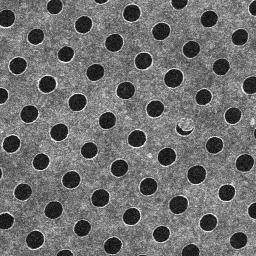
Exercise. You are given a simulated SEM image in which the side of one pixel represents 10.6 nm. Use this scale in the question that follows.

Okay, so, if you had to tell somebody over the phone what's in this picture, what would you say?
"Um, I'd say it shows a regular array of holes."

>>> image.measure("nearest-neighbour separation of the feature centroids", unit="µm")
0.363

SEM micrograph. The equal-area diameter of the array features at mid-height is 17.8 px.